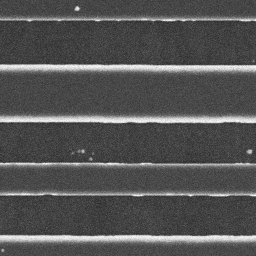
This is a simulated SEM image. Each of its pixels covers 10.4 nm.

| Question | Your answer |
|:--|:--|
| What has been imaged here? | lines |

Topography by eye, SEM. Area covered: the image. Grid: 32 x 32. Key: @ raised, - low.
@@@@@@@@@@@@@@@@@@@@@@@@@@@@@@@@
@@@@@@@@@@@@@@@@@@@@@@@@@@@@@@@@
---@---@----@------@@@--------@@
--------------------------------
--------------------------------
--------------------------------
--------------------------------
--------------------------------
@@@@@@@@@@@@@@@@@@@@@@@@@@@@@@@@
@@@@@@@@@@@@@@@@@@@@@@@@@@@@@@@@
@@@@@@@@@@@@@@@@@@@@@@@@@@@@@@@@
@@@@@@@@@@@@@@@@@@@@@@@@@@@@@@@@
@@@@@@@@@@@@@@@@@@@@@@@@@@@@@@@@
@@@@@@@@@@@@@@@@@@@@@@@@@@@@@@@@
@@@@@@@@@@@@@@@@@@@@@@@@@@@@@@@@
--------------------------------
--------------------------------
--------------------------------
--------------------------------
--------------------------------
@@@@@@@@@@@@@@@--@@-----------@@
@@@@@@@@@@@@@@@@@@@@@@@@@@@@@@@@
@@@@@@@@@@@@@@@@@@@@@@@@@@@@@@@@
@@@@@@@@@@@@@@@@@@@@@@@@@@@@@@@@
--------------------------------
--------------------------------
--------------------------------
--------------------------------
--------------------------------
--------------------------------
@@@@@@@@@@@@@@@@@@@@@@@@@@@@@@@@
@@@@@@@@@@@@@@@@@@@@@@@@@@@@@@@@